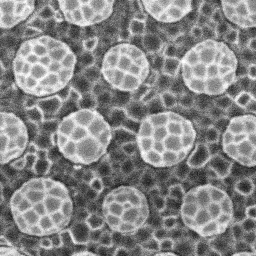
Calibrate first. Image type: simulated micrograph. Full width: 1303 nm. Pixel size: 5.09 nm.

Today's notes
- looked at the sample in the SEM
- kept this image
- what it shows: a regular array of raised bodies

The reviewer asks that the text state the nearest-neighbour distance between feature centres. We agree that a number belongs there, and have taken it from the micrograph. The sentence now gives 413 nm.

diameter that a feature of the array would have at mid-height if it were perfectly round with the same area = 269 nm